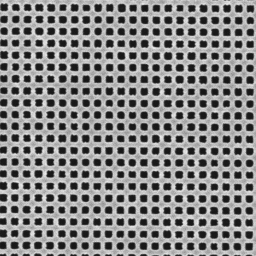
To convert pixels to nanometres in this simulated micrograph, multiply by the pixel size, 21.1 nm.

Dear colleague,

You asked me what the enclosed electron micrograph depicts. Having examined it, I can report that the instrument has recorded a regular array of holes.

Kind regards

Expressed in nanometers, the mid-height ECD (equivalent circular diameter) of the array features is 182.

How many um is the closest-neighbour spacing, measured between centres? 0.242